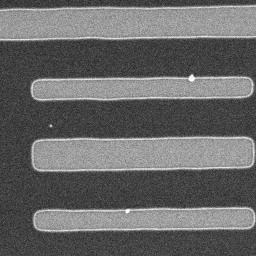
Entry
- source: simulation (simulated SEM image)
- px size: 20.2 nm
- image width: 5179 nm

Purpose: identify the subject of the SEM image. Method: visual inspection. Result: groups of lines, slits or small figures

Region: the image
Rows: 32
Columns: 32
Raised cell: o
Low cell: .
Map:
oooooooooooooooooooooooooooooooo
................................
................................
................................
................................
oooooooooooooooooooooooooooooooo
oooooooooooooooooooooooooooooooo
oooooooooooooooooooooooooooooooo
oooooooooooooooooooooooooooooooo
oooooooooooooooooooooooooooooooo
oooo...........................o
oooo...........................o
oooooooooooooooooooooooooooooooo
oooooooooooooooooooooooooooooooo
oooooooooooooooooooooooooooooooo
oooooooooooooooooooooooooooooooo
oooooooooooooooooooooooooooooooo
oooooo.........................o
oooo............................
oooo............................
oooo...........................o
oooooooooooooooooooooooooooooooo
oooooooooooooooooooooooooooooooo
oooooooooooooooooooooooooooooooo
oooooooooooooooooooooooooooooooo
oooooooooooooooooooooooooooooooo
ooooo...........................
oooo............................
ooooo..........................o
oooooooooooooooooooooooooooooooo
oooooooooooooooooooooooooooooooo
oooooooooooooooooooooooooooooooo